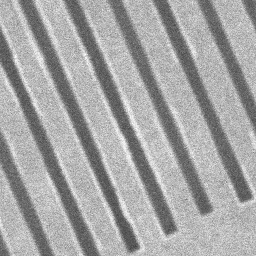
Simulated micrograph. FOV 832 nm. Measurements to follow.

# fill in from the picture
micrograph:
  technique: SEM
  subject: parallel lines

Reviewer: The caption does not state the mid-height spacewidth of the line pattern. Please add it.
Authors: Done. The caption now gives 43.6 nm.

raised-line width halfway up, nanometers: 90.6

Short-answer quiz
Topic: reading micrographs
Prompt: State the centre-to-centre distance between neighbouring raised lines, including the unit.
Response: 133 nanometres